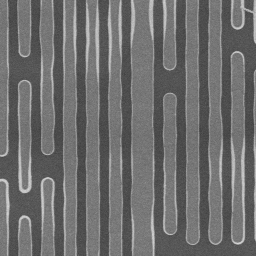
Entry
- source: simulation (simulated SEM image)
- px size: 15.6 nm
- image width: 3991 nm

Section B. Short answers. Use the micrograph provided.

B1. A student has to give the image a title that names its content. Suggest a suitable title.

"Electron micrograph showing groups of lines, slits or small figures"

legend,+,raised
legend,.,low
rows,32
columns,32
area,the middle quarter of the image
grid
+++...++...+++...+++++...+++...+
+++...++...+++...+++++.........+
+++...++...+++...+++++.........+
+++...++...+++...+++++.........+
+++...+++..+++...+++++.........+
+++...+++..+++...+++++.........+
+++...+++..+++...+++++.........+
+++...+++..+++...+++++....+....+
+++...+++..+++...+++++...+++...+
+++...+++..+++...+++++...+++...+
+++...+++..+++...+++++...+++...+
+++...+++..+++...+++++...+++...+
+++...+++..+++...+++++...+++...+
+++...+++..+++...+++++...+++...+
+++...++...+++...+++++...+++...+
+++...++...+++...+++++...+++...+
+++...++...+++...+++++...+++...+
+++...+++..+++...+++++...+++...+
+++...+++..+++...+++++...+++...+
+++...+++..+++...+++++...+++...+
+++...+++..+++...+++++...+++...+
+++...+++..+++...+++++...+++...+
+++...+++...++...+++++...+++...+
+++...+++...++...+++++...+++...+
+++...+++..+++...+++++...+++...+
+++...+++..+++...+++++...+++...+
+++...+++..+++...+++++...+++...+
+++...+++..+++...+++++...+++...+
+++...+++..+++...+++++...+++...+
+++...+++..+++...+++++...+++...+
+++...+++..+++...+++++...+++...+
+++...+++..+++...+++++...+++...+